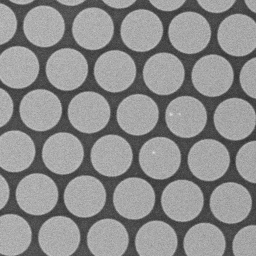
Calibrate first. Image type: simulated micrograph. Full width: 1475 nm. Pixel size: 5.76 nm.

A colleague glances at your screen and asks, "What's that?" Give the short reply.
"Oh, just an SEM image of an array of small figures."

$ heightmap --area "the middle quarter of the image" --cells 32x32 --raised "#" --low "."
######..##########..##########..
######..##########..##########..
######..##########..##########..
#####...##########..##########..
#####...#########...##########..
####.....#######.....########...
...........####.......######....
....#####...............##......
..########......######.......###
..#########...#########....#####
.##########...#########...######
.##########..##########...######
.##########..##########..#######
.##########..##########...######
..#########...#########...######
..########....#########...######
....#####......#######.....#####
##...............###........####
###......######........###......
####....########.....######.....
####...#########....########....
#####..##########..##########...
#####..##########..##########..#
#####..##########..##########..#
####...##########..##########..#
####...#########...##########..#
###.....########....########....
.........#####.......######.....
...#####..............####......
..#######.....#######......#####
.#########...#########....######
##########...#########...#######